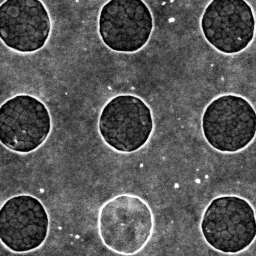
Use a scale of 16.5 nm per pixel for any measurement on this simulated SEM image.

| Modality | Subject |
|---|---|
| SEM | holes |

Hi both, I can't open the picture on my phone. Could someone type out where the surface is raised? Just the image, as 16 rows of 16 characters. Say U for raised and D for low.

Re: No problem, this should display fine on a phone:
DDDUUUDDDUUUUDDD
DDDUUUDDDUUUUDDD
DDDUUUDDDUUUUDDD
UUUUUUUUUUUUUUUU
UUUUUUUUUUUUUUUU
UUUUUUUUUUUUUUUU
DDDUUUUDDUUUUDDD
DDDUUUDDDUUUUDDD
DDDUUUDDDUUUUDDD
UUUUUUUUUUUUUUUU
UUUUUUUUUUUUUUUU
UUUUUUUUUUUUUUUU
UDUUUUUUUUUUUDDU
DDDUUUUUUUUUUDDD
DDDUUUUUUUUUUDDD
UDUUUUUUUUUUUDDU